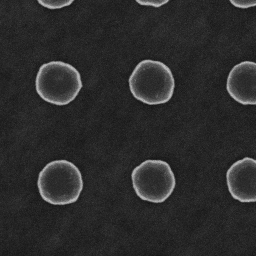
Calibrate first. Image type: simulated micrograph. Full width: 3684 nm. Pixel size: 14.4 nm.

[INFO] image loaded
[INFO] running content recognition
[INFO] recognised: raised bodies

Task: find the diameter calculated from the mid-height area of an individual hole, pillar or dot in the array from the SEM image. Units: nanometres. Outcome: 622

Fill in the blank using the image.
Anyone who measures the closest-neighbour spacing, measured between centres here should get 1.35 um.